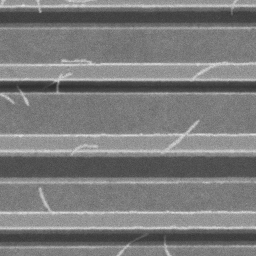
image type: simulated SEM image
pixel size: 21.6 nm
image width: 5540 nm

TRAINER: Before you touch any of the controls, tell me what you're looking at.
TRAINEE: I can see lines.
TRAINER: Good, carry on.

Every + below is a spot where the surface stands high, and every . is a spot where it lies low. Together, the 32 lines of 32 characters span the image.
++++++++++++++++++++++++++++++++
................................
................................
++++++++++++++++++++++++++++++++
++++++++++++++++++++++++++++++++
++++++++++++++++++++++++++++++++
++++++++++++++++++++++++++++++++
++++++++++++++++++++++++++++++++
++++++++++++++++++++++++++++++++
++++++++++++++++++++++++++++++++
................................
..+....+........................
++++++++++++++++++++++++++++++++
++++++++++++++++++++++++++++++++
++++++++++++++++++++++++++++++++
++++++++++++++++++++++++++++++++
++++++++++++++++++++++++++++++++
++++++++++++++++++++++++++++++++
++++++++++++++++++++++++++++++++
................................
................................
................................
................................
++++++++++++++++++++++++++++++++
++++++++++++++++++++++++++++++++
++++++++++++++++++++++++++++++++
++++++++++++++++++++++++++++++++
++++++++++++++++++++++++++++++++
++++++++++++++++++++++++++++++++
................................
................................
++++++++++++++++++++++++++++++++